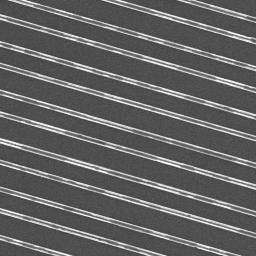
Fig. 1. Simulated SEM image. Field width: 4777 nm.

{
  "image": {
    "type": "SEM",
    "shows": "parallel lines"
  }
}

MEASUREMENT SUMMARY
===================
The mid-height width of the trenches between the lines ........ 0.305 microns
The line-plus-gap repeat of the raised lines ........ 0.434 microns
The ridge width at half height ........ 89.6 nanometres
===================